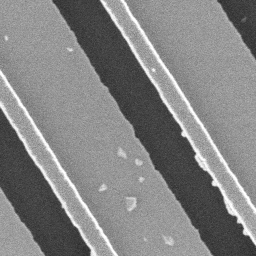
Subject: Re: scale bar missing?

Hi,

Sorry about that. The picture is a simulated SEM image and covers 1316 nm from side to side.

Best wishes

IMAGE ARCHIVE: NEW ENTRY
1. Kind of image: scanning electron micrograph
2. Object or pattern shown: lines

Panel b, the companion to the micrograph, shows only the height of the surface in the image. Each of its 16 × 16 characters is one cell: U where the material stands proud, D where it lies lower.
UUUUDDDUUUUUUUDD
UUUUDDDUUUUUUUUD
UUUUUDDDUUUUUUUD
UUUUUDDDUUUUUUUU
UUUUUUDDDUUUUUUU
UUUUUUUDDDUUUUUU
UUUUUUUDDDUUUUUU
DUUUUUUUDDDUUUUU
DUUUUUUUUDDDUUUU
DDUUUUUUUDDDUUUU
DDUUUUUUUUDDDUUU
DDDUUUUUUUDDDUUU
DDDDUUUUUUUDDDUU
UDDDUUUUUUUUDDDU
UUDDDUUUUUUUDDDU
UUDDDDUUUUUUUDDD